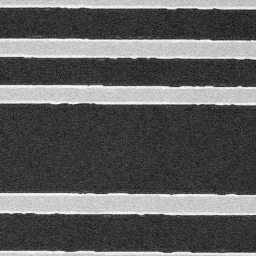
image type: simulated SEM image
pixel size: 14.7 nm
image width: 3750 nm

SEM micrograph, lines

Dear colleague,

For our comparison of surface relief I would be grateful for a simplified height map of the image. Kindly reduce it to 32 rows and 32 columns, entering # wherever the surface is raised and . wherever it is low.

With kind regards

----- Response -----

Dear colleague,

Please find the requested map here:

################################
................................
................................
................................
................................
################################
################################
................................
................................
................................
................................
################################
################################
................................
................................
................................
................................
................................
................................
................................
................................
................................
................................
................................
################################
################################
################################
................................
................................
................................
................................
########........................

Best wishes